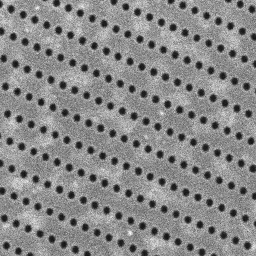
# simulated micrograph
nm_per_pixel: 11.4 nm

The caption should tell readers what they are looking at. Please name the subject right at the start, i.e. a regular array of holes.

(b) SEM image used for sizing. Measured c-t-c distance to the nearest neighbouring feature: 146 nm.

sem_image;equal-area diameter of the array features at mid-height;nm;86